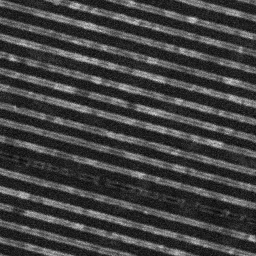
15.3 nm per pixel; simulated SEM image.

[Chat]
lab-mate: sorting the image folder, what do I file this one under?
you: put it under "parallel lines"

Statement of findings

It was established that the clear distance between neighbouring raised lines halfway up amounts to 196 nm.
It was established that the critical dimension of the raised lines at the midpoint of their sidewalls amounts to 55.5 nanometres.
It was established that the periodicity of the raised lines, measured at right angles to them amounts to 251 nm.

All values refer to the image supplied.